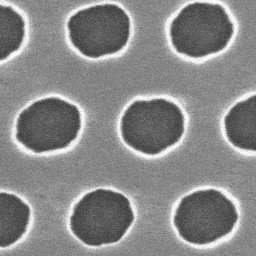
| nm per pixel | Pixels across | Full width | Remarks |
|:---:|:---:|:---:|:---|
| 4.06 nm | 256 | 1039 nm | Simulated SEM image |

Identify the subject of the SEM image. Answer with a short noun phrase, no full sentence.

holes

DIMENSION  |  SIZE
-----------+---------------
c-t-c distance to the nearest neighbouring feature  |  422 nanometers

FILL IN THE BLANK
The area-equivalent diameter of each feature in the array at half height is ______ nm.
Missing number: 252